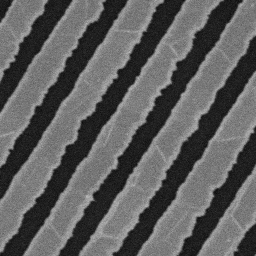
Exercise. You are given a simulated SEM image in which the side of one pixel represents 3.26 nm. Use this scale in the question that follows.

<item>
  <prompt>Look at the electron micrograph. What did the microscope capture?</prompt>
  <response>lines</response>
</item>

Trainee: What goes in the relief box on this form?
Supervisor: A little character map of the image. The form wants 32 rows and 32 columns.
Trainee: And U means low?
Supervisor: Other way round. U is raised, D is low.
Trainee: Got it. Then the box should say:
DUUUUUDDDUUUUDDDUUUUDDDUUUUDDDUU
DUUUUDDDUUUUUDDUUUUDDDUUUUDDDUUU
UUUUDDDDUUUUDDDUUUUDDDUUUUDDDUUU
UUUUDDDUUUUDDDUUUUDDDUUUUDDDUUUU
UUUDDDUUUUDDDUUUUUDDDUUUDDDDUUUU
UUDDDDUUUUDDDUUUUDDDUUUUDDDUUUUD
UUDDDUUUUDDDUUUUDDDUUUUUDDUUUUUD
UUDDUUUUDDDUUUUUDDDUUUUDDDUUUUDD
UDDDUUUUDDDUUUUDDDUUUUDDDUUUUDDD
DDDUUUUDDDUUUUUDDUUUUDDDUUUUUDDU
DDUUUUUDDUUUUUDDDUUUUDDUUUUUDDDU
DDUUUUDDDUUUUDDDUUUUDDDUUUUDDDUU
DUUUUDDDUUUUDDDUUUUDDDUUUUUDDDUU
UUUUDDDUUUUUDDDUUUUDDDUUUUDDDUUU
UUUUDDDUUUUDDDUUUUDDDUUUUDDDUUUU
UUUUDDUUUUDDDUUUUUDDDUUUUDDDUUUU
UUUDDDUUUUDDDUUUUDDDUUUUDDDUUUUU
UUDDDUUUUDDDUUUUDDDUUUUDDDUUUUUD
UDDDUUUUDDDUUUUUDDDUUUUDDDUUUUDD
UDDDUUUUDDDUUUUDDDUUUUDDDUUUUUDD
DDDUUUUDDDUUUUUDDUUUUDDDUUUUUDDD
DDUUUUUDDUUUUUDDDUUUUDDDUUUUUDDD
DDUUUUDDDUUUUDDDUUUUDDDUUUUUDDDU
DUUUUUDDUUUUDDDUUUUUDDUUUUUDDDUU
UUUUUDDDUUUUDDDUUUUDDDUUUUUDDUUU
UUUUDDDUUUUDDDUUUUUDDUUUUUDDDUUU
UUUDDDUUUUDDDDUUUUDDDUUUUUDDUUUU
UUUDDDUUUUDDDUUUUDDDUUUUUDDDUUUU
UUDDDUUUUDDDUUUUUDDUUUUUDDDUUUUD
UUDDUUUUUDDUUUUUDDDUUUUUDDUUUUDD
UDDDUUUUDDDUUUUDDDUUUUUDDUUUUUDD
DDDUUUUDDDUUUUDDDUUUUUDDDUUUUDDD